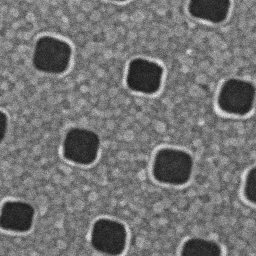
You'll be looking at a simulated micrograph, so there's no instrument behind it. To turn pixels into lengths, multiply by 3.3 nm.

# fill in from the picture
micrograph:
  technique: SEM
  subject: holes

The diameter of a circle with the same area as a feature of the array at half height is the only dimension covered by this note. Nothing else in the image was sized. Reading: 37.1 pixels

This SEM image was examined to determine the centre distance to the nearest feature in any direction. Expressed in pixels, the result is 94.